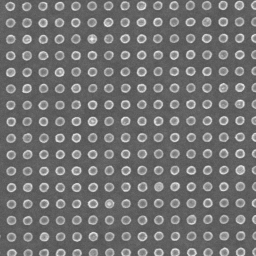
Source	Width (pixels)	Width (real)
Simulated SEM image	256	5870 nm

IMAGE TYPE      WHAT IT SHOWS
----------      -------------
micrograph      a regular array of raised bodies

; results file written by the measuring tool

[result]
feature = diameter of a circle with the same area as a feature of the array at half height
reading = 9.03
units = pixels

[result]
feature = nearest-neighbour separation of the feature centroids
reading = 372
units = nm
